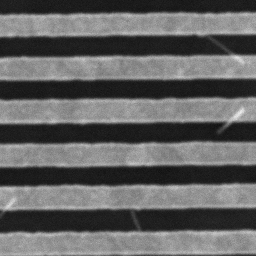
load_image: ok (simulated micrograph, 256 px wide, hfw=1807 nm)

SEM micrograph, lines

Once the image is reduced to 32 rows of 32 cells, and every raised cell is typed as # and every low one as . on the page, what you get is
................................
................................
################################
################################
####..#.........................
................................
................................
################################
################################
################################
................................
................................
......#############.############
################################
################################
................................
................................
................................
################################
################################
############################..##
................................
................................
################################
################################
################################
................................
................................
................................
################################
################################
################################